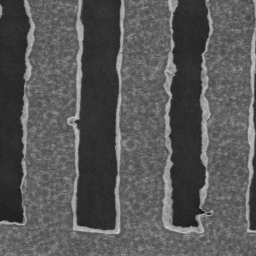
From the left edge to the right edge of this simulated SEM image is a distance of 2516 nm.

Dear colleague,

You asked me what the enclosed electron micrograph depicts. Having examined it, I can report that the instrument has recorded one or a few lines or trenches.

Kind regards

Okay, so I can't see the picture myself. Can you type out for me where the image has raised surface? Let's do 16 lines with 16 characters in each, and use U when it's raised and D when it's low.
DDUUUDDDUUUDDUUU
DDUUUDDDUUUDDUUU
DDUUUDDDUUUDDUUU
DDUUUDDUUUUDDUUU
DDUUUDDUUUUDDUUU
DDUUUDDUUUUDDUUU
DDUUUDDUUUUDDUUU
DDUUUDDUUUUDDUUU
DDUUUDDUUUDDDUUU
DDUUUDDUUUUDDUUU
DUUUUDDUUUUDDUUU
DUUUUDDUUUDDDUUU
DUUUUDDUUUDDDUUD
DUUUUDDUUUUDDUUD
UUUUUUUUUUUUUUUU
UUUUUUUUUUUUUUUU